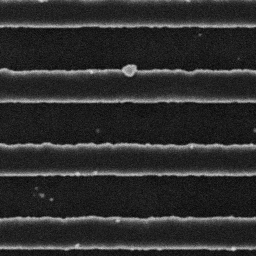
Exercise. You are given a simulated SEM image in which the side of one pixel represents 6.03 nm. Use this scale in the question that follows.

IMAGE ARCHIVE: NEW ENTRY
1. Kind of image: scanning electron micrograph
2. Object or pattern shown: lines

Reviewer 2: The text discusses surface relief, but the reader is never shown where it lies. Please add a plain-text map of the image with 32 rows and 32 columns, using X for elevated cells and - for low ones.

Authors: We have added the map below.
XXXXXXXXXXXXXXXXXXXXXXXXXXXXXXXX
XXXXXXXXXXXXXXXXXXXXXXXXXXXXXXXX
XXXXXXXXXXXXXXXXXXXXXXXXXXXXXXXX
--------------------------------
--------------------------------
--------------------------------
--------------------------------
--------------------------------
---------------XX---------------
XXXXXXXXXXXXXXXXXXXXXXXXXXXXXXXX
XXXXXXXXXXXXXXXXXXXXXXXXXXXXXXXX
XXXXXXXXXXXXXXXXXXXXXXXXXXXXXXXX
XXXXXXXXXXXXXXXXXXXXXXXXXXXXXXXX
--------------------------------
--------------------------------
--------------------------------
--------------------------------
--------------------------------
XXXXXXXXXXXXXXXXXXXXXXXXXXXXXXXX
XXXXXXXXXXXXXXXXXXXXXXXXXXXXXXXX
XXXXXXXXXXXXXXXXXXXXXXXXXXXXXXXX
XXXXXXXXXXXXXXXXXXXXXXXXXXXXXXXX
--------------------------------
--------------------------------
--------------------------------
--------------------------------
--------------------------------
XXXXXXXXXXXXXXXXXXXXXXXXXXXXXXXX
XXXXXXXXXXXXXXXXXXXXXXXXXXXXXXXX
XXXXXXXXXXXXXXXXXXXXXXXXXXXXXXXX
XXXXXXXXXXXXXXXXXXXXXXXXXXXXXXXX
--------------------------------